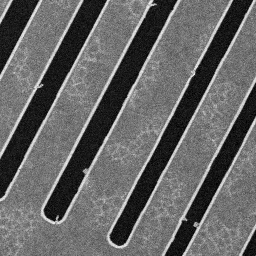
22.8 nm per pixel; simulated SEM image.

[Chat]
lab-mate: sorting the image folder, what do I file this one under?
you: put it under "one or a few lines or trenches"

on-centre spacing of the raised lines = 1460 nm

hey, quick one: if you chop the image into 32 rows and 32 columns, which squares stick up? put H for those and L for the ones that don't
HLLLLHHHHHLLLHHHHHHLLLHHHHHHHLLL
HLLLHHHHHLLLLHHHHHLLLLHHHHHHLLLH
LLLLHHHHHLLLHHHHHHLLLHHHHHHHLLLH
LLLHHHHHLLLLHHHHHLLLLHHHHHHLLLHH
LLLHHHHHLLLHHHHHHLLLHHHHHHHLLLHH
LLHHHHHLLLLHHHHHLLLLHHHHHHLLLHHH
LLHHHHHLLLHHHHHHLLLHHHHHHLLLHHHH
LHHHHHLLLLHHHHHLLLHHHHHHHLLLHHHH
LHHHHHLLLHHHHHLLLLHHHHHHLLLHHHHH
HHHHHLLLLHHHHHLLLHHHHHHHLLLHHHHH
HHHHHLLLHHHHHLLLLHHHHHHLLLHHHHHH
HHHHLLLLHHHHHLLLHHHHHHHLLLHHHHHL
HHHHLLLHHHHHLLLLHHHHHHLLLHHHHHHL
HHHLLLHHHHHHLLLHHHHHHHLLLHHHHHLL
HHHLLLHHHHHLLLLHHHHHHLLLHHHHHHLL
HHLLLHHHHHHLLLHHHHHHHLLLHHHHHLLL
HHLLLHHHHHLLLLHHHHHHLLLHHHHHLLLH
HLLLHHHHHHLLLHHHHHHHLLLHHHHHLLLH
LLLLHHHHHLLLLHHHHHHLLLHHHHHLLLHH
LLLHHHHHHLLLHHHHHHHLLLHHHHHLLLHH
LLLHHHHHLLLLHHHHHHLLLHHHHHLLLHHH
LLHHHHHHLLLHHHHHHHLLLHHHHHLLLHHH
LLHHHHHLLLLHHHHHHLLLHHHHHLLLHHHH
LHHHHHHLLLHHHHHHHLLHHHHHHLLLHHHH
LHHHHHLLLLHHHHHHLLLHHHHHLLLHHHHH
HHHHHHLLLHHHHHHHLLLHHHHHLLHHHHHH
HHHHHLLLHHHHHHHLLLHHHHHLLLHHHHHH
HHHHHHLLHHHHHHHLLHHHHHHLLHHHHHHH
HHHHHHHHHHHHHHLLLHHHHHLLLHHHHHHH
HHHHHHHHHHHHHHLLHHHHHHLLHHHHHHHL
HHHHHHHHHHHHHHLLHHHHHLLLHHHHHHHL
HHHHHHHHHHHHHHHHHHHHHLLHHHHHHHLL